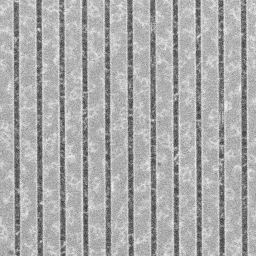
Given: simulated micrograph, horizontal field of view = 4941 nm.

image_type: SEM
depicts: parallel lines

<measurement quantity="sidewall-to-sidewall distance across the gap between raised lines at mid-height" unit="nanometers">123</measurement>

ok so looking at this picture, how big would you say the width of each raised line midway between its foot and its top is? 316 nm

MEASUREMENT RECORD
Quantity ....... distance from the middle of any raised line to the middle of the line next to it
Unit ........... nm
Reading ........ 439